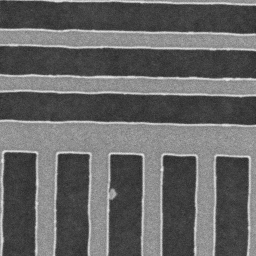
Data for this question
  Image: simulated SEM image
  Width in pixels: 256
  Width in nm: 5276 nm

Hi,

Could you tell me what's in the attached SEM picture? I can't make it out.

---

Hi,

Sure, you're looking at groups of lines, slits or small figures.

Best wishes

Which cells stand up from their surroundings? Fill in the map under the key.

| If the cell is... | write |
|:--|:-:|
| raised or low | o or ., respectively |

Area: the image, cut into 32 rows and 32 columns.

.............................ooo
................................
................................
................................
oooooooooooooooooooooooooooooooo
oooooooooooooooooooooooooooooooo
................................
................................
................................
o..oo...........................
oooooooooooooooooooooooooooooooo
......oooooooooooooooooooooooooo
................................
................................
................................
ooooooooooooooooooo.............
oooooooooooooooooooooooooooooooo
oooooooooooooooooooooooooooooooo
oooooooooooooooooooooooooooooooo
.....oo....ooo....ooo...ooo.oooo
.....oo....ooo....oo.....oo....o
.....oo....ooo....oo.....oo....o
.....oo....ooo....oo.....oo....o
.....oo....ooo....oo.....oo....o
.....oo....ooo....oo.....oo....o
.....oo....ooo....oo.....oo....o
.....oo....ooo....oo.....oo....o
.....oo....oo.....oo.....oo....o
.....oo....oo.....oo....ooo....o
.....oo....oo.....oo....ooo....o
.....oo....oo.....oo....ooo....o
.....oo....oo.....oo....ooo....o